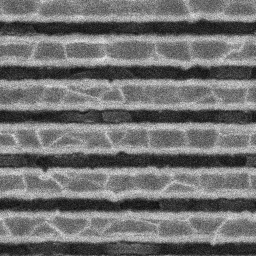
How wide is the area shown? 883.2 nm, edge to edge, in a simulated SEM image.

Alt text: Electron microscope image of parallel lines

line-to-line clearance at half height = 63.3 nm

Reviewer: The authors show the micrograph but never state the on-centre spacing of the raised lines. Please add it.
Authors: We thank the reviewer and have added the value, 152 nm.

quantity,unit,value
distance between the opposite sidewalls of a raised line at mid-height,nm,87.4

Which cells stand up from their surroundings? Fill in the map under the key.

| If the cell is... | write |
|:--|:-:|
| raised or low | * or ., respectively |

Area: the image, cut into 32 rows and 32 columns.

********************************
********************************
.....*...*......................
................................
................................
********************************
********************************
********************************
................................
................................
********************************
********************************
********************************
.........**.*...................
................................
................................
********************************
********************************
********************************
................................
................................
*****.**************************
********************************
********************************
...*.........***..........*.*...
................................
................................
********************************
********************************
********************************
................................
................................